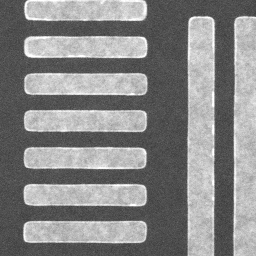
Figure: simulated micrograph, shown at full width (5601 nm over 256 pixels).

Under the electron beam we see groups of lines, slits or small figures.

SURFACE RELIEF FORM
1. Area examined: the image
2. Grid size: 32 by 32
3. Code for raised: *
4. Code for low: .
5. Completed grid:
...***************..............
...***************..............
........................***...**
........................***..***
........................***..***
...***************......***...**
...***************......***...**
........................***..***
........................***..***
...***************......***..***
...***************......***..***
...***************......***..***
........................***..***
........................***..***
...***************......***..***
...***************......***..***
........................***..***
........................***..***
........................***..***
...***************......***..***
...***************......***..***
........................***..***
........................***..***
...***************......***..***
...***************......***..***
....**************......***..***
........................***..***
........................***..***
...***************......***..***
...***************......***..***
........................***..***
........................***..***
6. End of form